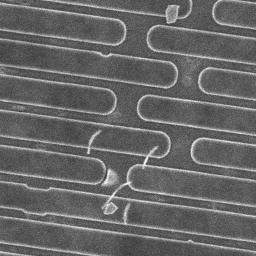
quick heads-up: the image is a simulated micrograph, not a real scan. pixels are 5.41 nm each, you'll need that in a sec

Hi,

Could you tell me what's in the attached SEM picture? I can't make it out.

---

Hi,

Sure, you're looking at parallel lines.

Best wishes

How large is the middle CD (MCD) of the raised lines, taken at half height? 143 nm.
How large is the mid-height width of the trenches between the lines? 50.3 nanometres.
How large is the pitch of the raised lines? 190 nm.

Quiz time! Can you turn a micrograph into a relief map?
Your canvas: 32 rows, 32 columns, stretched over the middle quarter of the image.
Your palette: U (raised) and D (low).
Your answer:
UUUUUUUUUUUUUUUUUUUUUUUUUUUUDDDD
UUUUUUUUUUUUUUUUUUUUUUUUUUUUDDDD
DUUUUUUUUUUUUUUUUUUUUUUUUUUUDDDD
DDDDDDDDDUUUUUUUUUUUUUUUUUUUDDUD
DDDDDDDDDDDDDDDDUUUUUUUUUUUUDDUD
UUUUUDDDDDDDDDDDDDDDDUUUUUUDDDDD
UUUUUUUUUUUUDDDDDDDDDDDDDDDDDDDD
UUUUUUUUUUUUUDDDDDDDDDDDDDDDDDDD
UUUUUUUUUUUUUDDDDDDDUUUUUUUDDDDD
UUUUUUUUUUUUUDDDDDDUUUUUUUUUUUUU
UUUUUUUUUUUUUDDDDDDUUUUUUUUUUUUU
DUUUUUUUUUUUDDDDDDUUUUUUUUUUUUUU
DDDDDDDDUUUDDDDDDDDUUUUUUUUUUUUU
DDDDDDDDDDDDDDDDDDDUUUUUUUUUUUUU
UUUUUUDDDDDDDDDDDDDDDDDDUUUUUUUU
UUUUUUUUUUUUUDDDDDDDDDDDDDDDDDDD
UUUUUUUUUUUUUUUUUUUUUDDDDDDDDDDD
UUUUUUUUUUUUUUUUUUUUUUUUUDDDDDDD
UUUUUUUUUUUUUUUUUUUUUUUUUUDDDDDD
UUUUUUUUUUUUUUUUUUUUUUUUUUUDDDDD
DDUUUUUUUUUUUUUUUUUUUUUUUUUDDDDD
DDDDDDUDDUUUUUUUUUUUUUUUUUDDDDDD
DDDDDDDDDDDDDDDDDUUUUUUUUUDDDDDD
UUUUUUUDDDDDDDDDDDDDDDDDDDDDDDDD
UUUUUUUUUUDDDDDDDDDDDDDDDDDDDDDD
UUUUUUUUUUDDDDDDDUUUUUDDDDDDDDDD
UUUUUUUUUUDUDDDDUUUUUUUUUUUUUDDD
UUUUUUUUUUUUUDDDUUUUUUUUUUUUUUUU
UUUUUUUUUUDUUDDDUUUUUUUUUUUUUUUU
DDDUUUUUUDUUUDDDUUUUUUUUUUUUUUUU
DDDDDDDDDDDDDDDDUUUUUUUUUUUUUUUU
UDDDDDDDDDDDDDDDDDUUUUUUUUUUUUUU